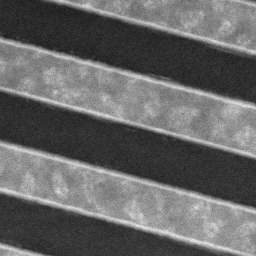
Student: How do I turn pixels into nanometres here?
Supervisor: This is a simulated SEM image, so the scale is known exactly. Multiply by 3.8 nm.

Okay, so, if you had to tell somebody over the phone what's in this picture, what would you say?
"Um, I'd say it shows one or a few lines or trenches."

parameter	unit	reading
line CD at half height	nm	185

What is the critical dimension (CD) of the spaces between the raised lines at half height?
0.192 micrometres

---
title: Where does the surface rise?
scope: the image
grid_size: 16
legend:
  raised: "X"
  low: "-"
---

-----XXXXXXXXXXX
---------XXXXXXX
-------------XXX
XXXX------------
XXXXXXXX--------
XXXXXXXXXXXX----
---XXXXXXXXXXXX-
-------XXXXXXXXX
-----------XXXXX
XX-------------X
XXXXXX----------
XXXXXXXXXX------
--XXXXXXXXXXXX--
------XXXXXXXXXX
----------XXXXXX
X------------XXX